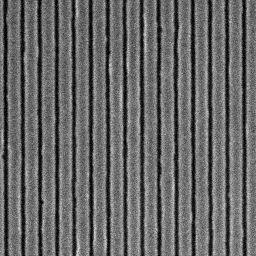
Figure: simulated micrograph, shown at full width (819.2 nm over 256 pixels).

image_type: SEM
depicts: parallel lines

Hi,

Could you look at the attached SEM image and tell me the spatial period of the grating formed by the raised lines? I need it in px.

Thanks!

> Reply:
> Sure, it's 17.1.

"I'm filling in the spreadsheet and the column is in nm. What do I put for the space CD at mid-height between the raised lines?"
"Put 14.8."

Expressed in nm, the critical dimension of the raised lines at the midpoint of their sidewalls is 41.6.